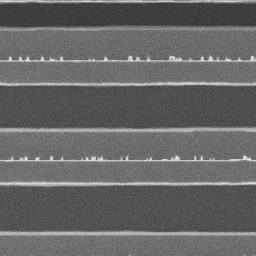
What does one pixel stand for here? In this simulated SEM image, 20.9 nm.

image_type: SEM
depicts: lines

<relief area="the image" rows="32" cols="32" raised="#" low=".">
................................
................................
................................
................................
################################
################################
################################
################################
################################
################################
................###.............
................................
................................
................................
................................
................................
################################
################################
################################
################################
################################
################################
################################
................................
................................
................................
................................
................................
................................
################################
################################
################################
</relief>